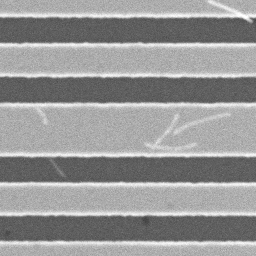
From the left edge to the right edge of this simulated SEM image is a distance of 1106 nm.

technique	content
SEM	lines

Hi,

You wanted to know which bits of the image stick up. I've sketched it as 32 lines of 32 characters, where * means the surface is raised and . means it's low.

********************************
********************************
................................
................................
................................
.........**......*......*.......
********************************
********************************
********************************
.*.**.*****.**..**...*********..
................................
................................
................................
********************************
********************************
********************************
********************************
********************************
********************************
...........*..*...*....*........
................................
................................
................................
********************************
********************************
********************************
********************************
................................
................................
................................
********************************
********************************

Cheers